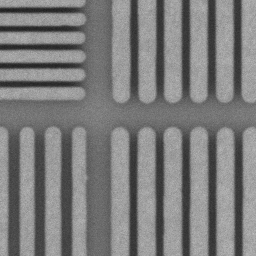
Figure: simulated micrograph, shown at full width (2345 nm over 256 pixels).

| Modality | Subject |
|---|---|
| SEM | groups of lines, slits or small figures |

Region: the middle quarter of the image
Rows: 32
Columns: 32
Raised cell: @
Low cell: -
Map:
------------@@@@---@@@@--@@@@---
@@@@@-------@@@@---@@@@--@@@@---
@@@@@-------@@@@---@@@@--@@@@---
@@@@@-------@@@@---@@@@--@@@@---
------------@@@@---@@@@--@@@@---
------------@@@@---@@@@--@@@@---
@@@@@-------@@@@---@@@@--@@@@---
@@@@@-------@@@@---@@@@--@@@@---
@@@@@-------@@@@---@@@@--@@@@---
--------------@-----@@----@@----
--------------------------------
--------------------------------
--------------------------------
--------------------------------
--------------------------------
--------------------------------
--@@@--------@@@---@@@----@@@---
--@@@-------@@@@---@@@@--@@@@---
--@@@-------@@@@---@@@@--@@@@---
--@@@-------@@@@---@@@@--@@@@---
--@@@-------@@@@---@@@@--@@@@---
--@@@-------@@@@---@@@@--@@@@---
--@@@-------@@@@---@@@@--@@@@---
--@@@-------@@@@---@@@@--@@@@---
--@@@-------@@@@---@@@@--@@@@---
--@@@-------@@@@---@@@@--@@@@---
--@@@-------@@@@--@@@@@--@@@@---
--@@@-------@@@@---@@@@--@@@@---
--@@@-------@@@@---@@@@--@@@@---
--@@@-------@@@@---@@@@--@@@@---
--@@@-------@@@@---@@@@--@@@@---
--@@@-------@@@@--@@@@@--@@@@---